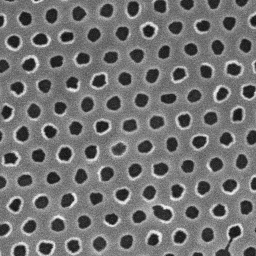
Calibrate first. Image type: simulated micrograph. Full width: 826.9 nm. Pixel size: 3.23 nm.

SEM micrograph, a regular array of holes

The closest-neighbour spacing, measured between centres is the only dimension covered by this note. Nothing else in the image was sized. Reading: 84.1 nm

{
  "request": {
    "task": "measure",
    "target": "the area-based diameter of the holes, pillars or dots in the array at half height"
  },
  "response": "41.6 nanometres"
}